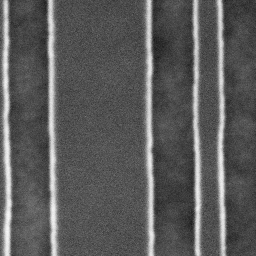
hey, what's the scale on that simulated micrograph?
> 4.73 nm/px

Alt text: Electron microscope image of lines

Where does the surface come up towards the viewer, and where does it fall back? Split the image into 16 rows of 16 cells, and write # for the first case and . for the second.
...######...##..
...######...##..
...######...##..
...######...##..
...######...##..
...######...##..
...######...##..
...######...##..
...######...##..
...######...##..
#..######...##..
#..######...##..
#..######...##..
#..######...##..
#..######...##..
#..######...##..